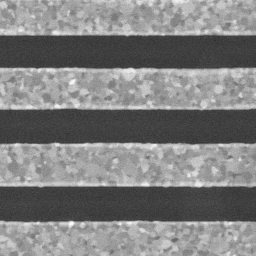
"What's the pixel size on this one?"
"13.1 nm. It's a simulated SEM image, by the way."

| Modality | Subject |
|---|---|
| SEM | lines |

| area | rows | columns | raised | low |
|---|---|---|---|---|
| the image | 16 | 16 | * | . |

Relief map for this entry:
****************
****************
................
................
****************
****************
****************
................
................
****************
****************
****************
................
................
****************
****************